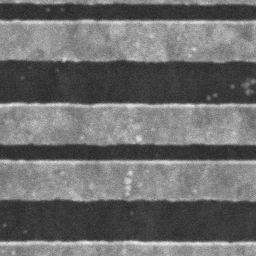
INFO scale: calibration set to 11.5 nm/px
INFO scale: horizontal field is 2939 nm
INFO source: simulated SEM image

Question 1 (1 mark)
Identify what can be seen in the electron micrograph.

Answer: lines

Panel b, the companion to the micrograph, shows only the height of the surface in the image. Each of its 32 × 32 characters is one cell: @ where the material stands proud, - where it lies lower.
----------@@-----------@-@@----@
--------------------------------
--------------------------------
@@@@@@@@@@@@@@@@@@@@@@@@@@@@@@@@
@@@@@@@@@@@@@@@@@@@@@@@@@@@@@@@@
@@@@@@@@@@@@@@@@@@@@@@@@@@@@@@@@
@@@@@@@@@@@@@@@@@@@@@@@@@@@@@@@@
---------@-@@@---@@@@--@@@@@@-@@
--------------------------------
--------------------------------
--------------------------------
--------------------------------
--------------------------------
@@@@@@@@@@@@@@@@@@@@@@@@@@@@@@@@
@@@@@@@@@@@@@@@@@@@@@@@@@@@@@@@@
@@@@@@@@@@@@@@@@@@@@@@@@@@@@@@@@
@@@@@@@@@@@@@@@@@@@@@@@@@@@@@@@@
@@@@@@@@@@@@@@@@@@@@@@@@@@@@@@@@
--------------------------------
--------------------------------
@@@@@@@@@@@@@@@@@@@@@@@@@@@@@@@@
@@@@@@@@@@@@@@@@@@@@@@@@@@@@@@@@
@@@@@@@@@@@@@@@@@@@@@@@@@@@@@@@@
@@@@@@@@@@@@@@@@@@@@@@@@@@@@@@@@
@@@@@@@@@@@@@@@@@@@@@@@@@@@@@@@@
--------------------------------
--------------------------------
--------------------------------
--------------------------------
--------------------------------
@@@@@@@@@@@@@@@@@@@@@@@@@@@@@@@@
@@@@@@@@@@@@@@@@@@@@@@@@@@@@@@@@